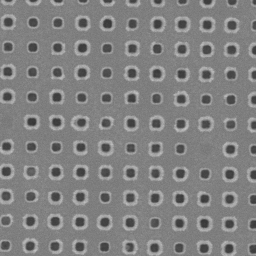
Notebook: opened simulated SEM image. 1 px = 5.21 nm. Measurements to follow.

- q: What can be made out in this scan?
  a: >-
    a regular array of holes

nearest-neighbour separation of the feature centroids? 0.128 um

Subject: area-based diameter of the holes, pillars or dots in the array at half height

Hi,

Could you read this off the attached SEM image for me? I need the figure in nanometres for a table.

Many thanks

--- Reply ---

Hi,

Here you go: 53.2